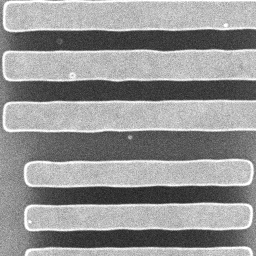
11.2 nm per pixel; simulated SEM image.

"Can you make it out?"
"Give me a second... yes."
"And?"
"groups of lines, slits or small figures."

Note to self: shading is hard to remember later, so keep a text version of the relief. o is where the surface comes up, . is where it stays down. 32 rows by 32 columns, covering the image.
.ooooooooooooooooooooooooooooooo
.ooooooooooooooooooooooooooooooo
.ooooooooooooooooooooooooooooooo
.ooooooooooooooooooooooooooooooo
................................
................................
.oooo.oooooooooooooooooooooooooo
oooooooooooooooooooooooooooooooo
oooooooooooooooooooooooooooooooo
.ooooooooooooooooooooooooooooooo
................................
................................
................................
.ooooooooooooooooooooooooooooooo
oooooooooooooooooooooooooooooooo
oooooooooooooooooooooooooooooooo
................................
................................
................................
................................
....ooooooooooooooooooooooooooo.
...ooooooooooooooooooooooooooooo
...oooooooooooooooooooooooooooo.
................................
................................
........................oooo....
...oooooooooooooooooooooooooooo.
...oooooooooooooooooooooooooooo.
...oooooooooooooooooooooooooooo.
................................
................................
...oooooooooooooooooooooooooooo.